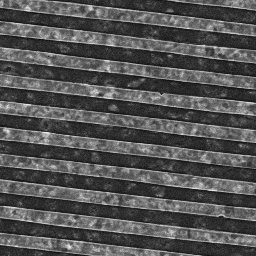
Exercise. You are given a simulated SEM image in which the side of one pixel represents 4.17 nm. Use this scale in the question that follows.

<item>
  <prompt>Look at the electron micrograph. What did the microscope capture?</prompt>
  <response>parallel lines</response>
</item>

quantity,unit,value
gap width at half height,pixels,14.7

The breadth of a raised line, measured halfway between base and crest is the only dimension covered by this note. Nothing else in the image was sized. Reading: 46.1 nanometers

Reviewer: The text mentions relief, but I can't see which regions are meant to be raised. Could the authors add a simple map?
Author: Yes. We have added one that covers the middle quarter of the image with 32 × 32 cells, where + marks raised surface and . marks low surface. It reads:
+++++++++++++++++++++...........
.......+++++++++++++++++++++++..
................++++++++++++++++
........................++++++++
.................++............+
++++++++........++..............
+++++++++++++++++...............
...+++++++++++++++++++++.+......
..........++++++++++++++++++++++
...................+++++++++++++
............+.............++++++
++..........+...................
+++++++++++++...................
++++++++++++++++++++++..........
......++++++++++++++++++++++++..
...............+++++++++++++++++
.....................+++++++++++
............................++++
+++++...........................
++++++++++++++++................
+++++++++++++++++++++++++.......
........++++++++++++++++++++++++
.......+.........+++++++++++++++
.......+..................++++++
+++.............................
++++++++++......................
++++++++++++++++++++............
....+++++++++++++++++++++++++...
.............+++++++++++++++++++
....................++++++++++++
...........................+++++
++++++..........................